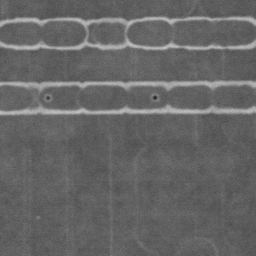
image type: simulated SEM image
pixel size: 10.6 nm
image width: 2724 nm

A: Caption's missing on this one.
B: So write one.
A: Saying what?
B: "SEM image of wiring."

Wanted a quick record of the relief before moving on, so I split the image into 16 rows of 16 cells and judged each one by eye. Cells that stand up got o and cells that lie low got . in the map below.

................
oooooooooooooooo
oooooooooooooooo
................
................
oooooooooooooooo
oooooooooooooooo
................
................
................
................
................
................
................
................
................